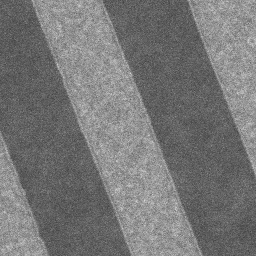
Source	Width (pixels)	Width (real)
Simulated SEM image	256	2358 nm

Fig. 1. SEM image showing one or a few lines or trenches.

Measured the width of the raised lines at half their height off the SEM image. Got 744 nm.